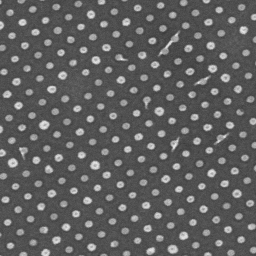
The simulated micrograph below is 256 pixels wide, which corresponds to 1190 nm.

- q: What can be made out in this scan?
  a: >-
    a regular array of raised bodies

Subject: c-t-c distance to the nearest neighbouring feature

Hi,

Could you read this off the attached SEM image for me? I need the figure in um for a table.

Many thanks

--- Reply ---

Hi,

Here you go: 0.0733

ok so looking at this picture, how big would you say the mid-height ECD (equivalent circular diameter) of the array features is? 33.6 nm